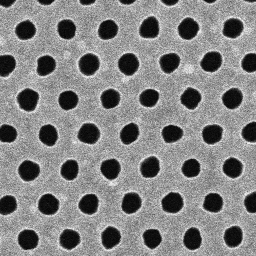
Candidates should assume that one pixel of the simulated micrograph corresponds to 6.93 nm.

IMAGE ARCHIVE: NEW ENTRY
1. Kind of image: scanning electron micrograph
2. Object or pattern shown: a regular array of holes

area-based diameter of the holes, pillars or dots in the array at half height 137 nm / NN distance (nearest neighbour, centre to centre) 274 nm